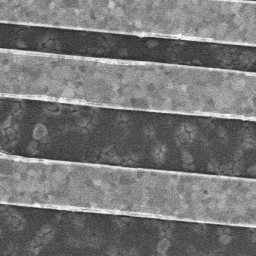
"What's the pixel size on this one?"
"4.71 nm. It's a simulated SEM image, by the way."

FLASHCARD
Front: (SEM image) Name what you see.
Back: one or a few lines or trenches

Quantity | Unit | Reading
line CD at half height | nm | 221